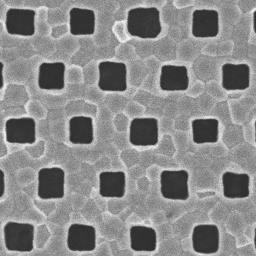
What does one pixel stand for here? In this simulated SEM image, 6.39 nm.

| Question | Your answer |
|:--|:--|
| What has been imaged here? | a regular array of holes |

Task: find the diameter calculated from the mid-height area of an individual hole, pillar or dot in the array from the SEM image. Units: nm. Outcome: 189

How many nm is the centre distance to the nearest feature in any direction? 390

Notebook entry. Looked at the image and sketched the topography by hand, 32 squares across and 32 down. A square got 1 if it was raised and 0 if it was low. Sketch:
11111111111111111111111111111111
10001111100011110000111100011111
10001111100011110000111100011111
10001111100011110000111100011111
11111111111111111000111100011111
11111111111111111111111111111111
11111111111111111111111111111111
11111111111111111111111111111111
11111000111100001111000111110001
11111000111100001111000111110001
11111000111100001111000111110001
11111111111111111111111111111111
11111111111111111111111111111111
11111111111111111111111111111111
11111111111111111111111111111111
10001111100111110000111100011111
10001111100011110000111100011111
10001111100111110000111100011111
11111111111111111111111111111111
11111111111111111111111111111111
11111111111111111111111111111111
11111000111110011111000111111111
01111000111100001111000111110001
01111000111100001111000011110001
11111000111110011111000011110001
11111111111111111111111111111111
11111111111111111111111111111111
11111111111111111111111111111111
10001111100011111001111100011111
10001111000011110001111100011111
10001111000011110000111100011111
11111111111111111111111110011111